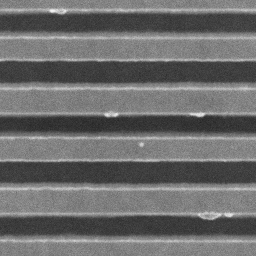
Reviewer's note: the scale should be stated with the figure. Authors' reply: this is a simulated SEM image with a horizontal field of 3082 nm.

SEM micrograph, lines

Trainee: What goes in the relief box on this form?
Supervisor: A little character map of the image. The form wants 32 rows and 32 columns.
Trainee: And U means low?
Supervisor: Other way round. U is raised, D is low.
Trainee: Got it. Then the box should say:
UUUUUUUUUUUUUUUUUUUUUUUUUUUUUUUU
DDDDDDDUDDDDDDDDDDDDDDDDDDDDDDDD
DDDDDDDDDDDDDDDDDDDDDDDDDDDDDDDD
DDDDDDDDDDDDDDDDDDDDDDDDDDDDDDDD
DDDDDDDDDDDDDDDDDDDDDDDDDDDDDDDD
UUUUUUUUUUUUUUUUUUUUUUUUUUUUUUUU
UUUUUUUUUUUUUUUUUUUUUUUUUUUUUUUU
UDDDUUDDUUDDUDDUUUUUUDUDUUUUUUUD
DDDDDDDDDDDDDDDDDDDDDDDDDDDDDDDD
DDDDDDDDDDDDDDDDDDDDDDDDDDDDDDDD
DDDDDDDDDDDDDDDDDDDDDDDDDDDDDDDD
UUUUUUUUUUUUUUUUUUUUUUUUUUUUUUUU
UUUUUUUUUUUUUUUUUUUUUUUUUUUUUUUU
UUUUUUUUUUUUUUUUUUUUUUUUUUUUUUUU
DDDDDDDDDDDDDUDDDDDDDDDDDDDDDDDD
DDDDDDDDDDDDDDDDDDDDDDDDDDDDDDDD
DDDDDDDDDDDDDDDDDDDDDDDDDDDDDDDD
UUUUUUUUUUUUUUUUUUUUUUUUUUUUUUUU
UUUUUUUUUUUUUUUUUUUUUUUUUUUUUUUU
UUUUUUUUUUUUUUUUUUUUUUUUUUUUUUUU
DDDDDDDDDDDDDDDDDDDDDDDDDDDDDDDD
DDDDDDDDDDDDDDDDDDDDDDDDDDDDDDDD
DDDDDDDDDDDDDDDDDDDDDDDDDDDDDDDD
UUUUUUUUUUUUUDDUDDDUUUUUUDUDUUDU
UUUUUUUUUUUUUUUUUUUUUUUUUUUUUUUU
UUUUUUUUUUUUUUUUUUUUUUUUUUUUUUUU
UUUUUUUUUUUUUUUUUUUUUUUUUUUUUUUU
DDDDDDDDDDDDDDDDDDDDDDDDDDDDDDDD
DDDDDDDDDDDDDDDDDDDDDDDDDDDDDDDD
DDDDDDDDDDDDDDDDDDDDDDDDDDDDDDDD
UUUUUUUUUUUUUUUUUUUUUUUUUUUUUUUU
UUUUUUUUUUUUUUUUUUUUUUUUUUUUUUUU